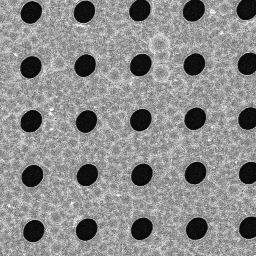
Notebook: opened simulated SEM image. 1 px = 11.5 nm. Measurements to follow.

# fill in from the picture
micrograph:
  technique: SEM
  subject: a regular array of holes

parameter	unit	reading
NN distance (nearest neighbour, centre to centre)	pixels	54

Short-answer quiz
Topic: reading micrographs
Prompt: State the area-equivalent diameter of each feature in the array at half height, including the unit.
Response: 251 nanometers